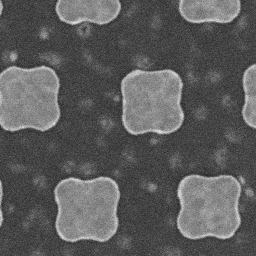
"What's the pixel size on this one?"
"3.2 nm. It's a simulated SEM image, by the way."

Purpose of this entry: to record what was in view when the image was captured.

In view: raised bodies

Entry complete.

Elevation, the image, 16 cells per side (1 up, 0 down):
0000111000011110
0000000000000000
0000000000000000
0000000000000000
1110000011100001
1111000011100001
1111000011100001
1111000011100001
0000000000000000
0000000000000000
0000000000000000
0000111000011110
0000111000011110
0000111000011110
0000111000011110
0000000000000000